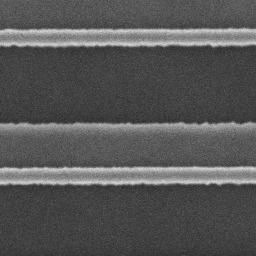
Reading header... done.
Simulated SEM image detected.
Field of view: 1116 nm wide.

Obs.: lines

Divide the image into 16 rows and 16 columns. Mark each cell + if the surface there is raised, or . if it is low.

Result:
++++++++++++++++
++++++++++++++++
++++++++++++++++
................
................
................
................
................
++++++++++++++++
++++++++++++++++
++++++++++++++++
++.+...+........
................
................
................
................